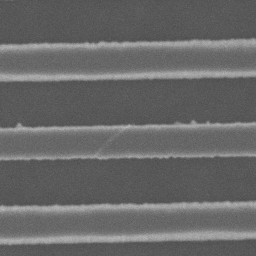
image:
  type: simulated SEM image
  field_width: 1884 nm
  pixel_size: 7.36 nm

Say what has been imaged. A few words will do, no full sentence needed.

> lines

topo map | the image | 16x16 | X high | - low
----------------
----------------
----------------
XXXXXXXXXXXXXXXX
XXXXXXXXXXXXXXXX
----------------
----------------
----------------
XXXXXXXXXXXXXXXX
XXXXXXXXXXXXXXXX
----------------
----------------
----------------
XXXXXXXXXXXXXXXX
XXXXXXXXXXXXXXXX
----------------